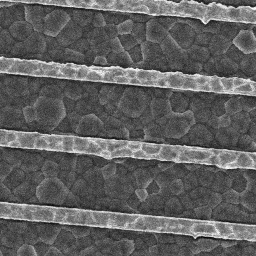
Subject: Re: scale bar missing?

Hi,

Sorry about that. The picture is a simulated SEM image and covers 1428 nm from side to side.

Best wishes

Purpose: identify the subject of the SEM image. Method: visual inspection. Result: one or a few lines or trenches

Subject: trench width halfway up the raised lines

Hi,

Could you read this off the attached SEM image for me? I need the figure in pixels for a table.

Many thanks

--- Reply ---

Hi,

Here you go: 56.7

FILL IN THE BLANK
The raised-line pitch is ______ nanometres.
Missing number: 403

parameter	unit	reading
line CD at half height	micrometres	0.0883